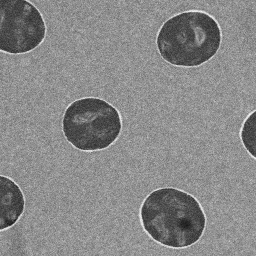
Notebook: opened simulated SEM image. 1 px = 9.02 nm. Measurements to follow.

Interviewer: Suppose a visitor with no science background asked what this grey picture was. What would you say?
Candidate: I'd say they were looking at holes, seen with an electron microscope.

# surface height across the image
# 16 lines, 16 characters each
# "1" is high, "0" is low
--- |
0011111111111111
0001111111000011
0001111111000011
1111111111000111
1111111111111111
1111111111111111
1111100111111111
1111000011111110
1111000111111110
1111111111111111
1111111111111111
0111111111111111
0111111110001111
0111111110000111
1111111110000111
1111111111111111